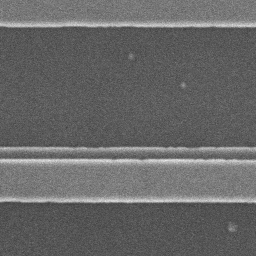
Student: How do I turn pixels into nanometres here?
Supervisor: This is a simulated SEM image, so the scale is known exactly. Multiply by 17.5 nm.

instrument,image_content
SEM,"lines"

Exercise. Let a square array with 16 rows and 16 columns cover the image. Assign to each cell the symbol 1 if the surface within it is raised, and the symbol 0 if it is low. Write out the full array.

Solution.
1111111111111111
1111111111111111
0000000000000000
0000000000000000
0000000000000000
0000000000000000
0000000000000000
0000000000000000
0000000000000000
0000000000000000
1111111111111111
1111111111111111
1111111111111111
0000000000000000
0000000000000000
0000000000000000